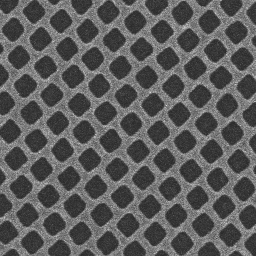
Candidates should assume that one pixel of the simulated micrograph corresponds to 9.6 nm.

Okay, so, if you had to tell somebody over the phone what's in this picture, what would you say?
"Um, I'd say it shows a regular array of holes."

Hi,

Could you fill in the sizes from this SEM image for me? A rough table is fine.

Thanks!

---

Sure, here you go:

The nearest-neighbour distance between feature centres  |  263 nanometers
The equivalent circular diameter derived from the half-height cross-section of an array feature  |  210 nm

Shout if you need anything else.